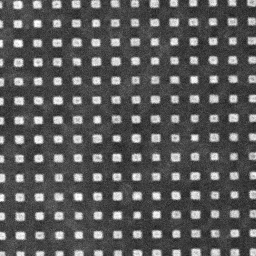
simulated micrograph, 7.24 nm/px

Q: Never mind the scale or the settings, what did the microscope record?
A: a regular array of raised bodies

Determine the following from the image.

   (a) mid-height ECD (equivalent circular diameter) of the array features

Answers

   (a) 63.8 nanometres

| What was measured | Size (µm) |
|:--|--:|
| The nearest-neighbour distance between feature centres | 0.137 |